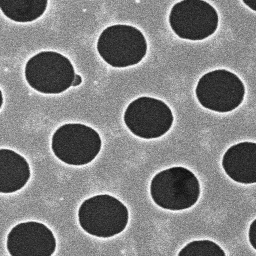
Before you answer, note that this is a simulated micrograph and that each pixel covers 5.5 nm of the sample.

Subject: holes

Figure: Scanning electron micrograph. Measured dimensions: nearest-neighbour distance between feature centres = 418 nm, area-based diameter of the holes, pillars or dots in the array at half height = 255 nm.